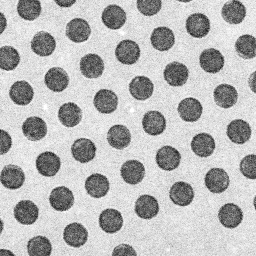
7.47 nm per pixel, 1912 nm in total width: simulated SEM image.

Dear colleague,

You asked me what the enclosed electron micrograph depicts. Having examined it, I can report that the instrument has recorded a regular array of holes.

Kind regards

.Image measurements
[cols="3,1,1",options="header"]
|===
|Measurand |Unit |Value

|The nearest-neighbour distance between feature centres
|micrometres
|0.281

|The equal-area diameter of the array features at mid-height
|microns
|0.194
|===